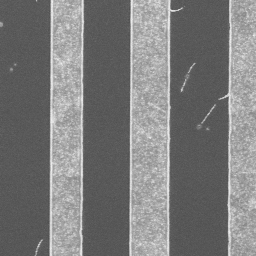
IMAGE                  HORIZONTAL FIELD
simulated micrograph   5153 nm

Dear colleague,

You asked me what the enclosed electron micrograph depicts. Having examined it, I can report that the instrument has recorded one or a few lines or trenches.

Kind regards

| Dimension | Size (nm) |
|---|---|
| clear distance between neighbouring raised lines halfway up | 1100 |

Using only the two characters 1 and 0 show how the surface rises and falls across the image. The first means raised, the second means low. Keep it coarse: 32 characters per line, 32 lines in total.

00000001110000001111100000000111
00000001110000001111100000000111
00000001110000001111100000000111
00000001110000001111100000000111
00000001110000001111100000000111
00000001110000001111100000000111
00000001110000001111100000000111
00000001110000001111100000000111
00000001110000001111100000000111
00000001110000001111100000000111
00000001110000001111100000000111
00000001110000001111100000000111
00000011110000001111100000000111
00000011110000001111100000000111
00000001110000001111100000000111
00000001110000001111100000000111
00000001110000001111100000000111
00000011110000001111100000000110
00000011110000001111100000000111
00000011110000001111100000000111
00000011110000001111100000000111
00000011110000001111100000000111
00000011110000001111100000000111
00000011110000001111100000000111
00000011110000001111100000000111
00000011110000001111100000000111
00000011110000001111100000000111
00000011110000001111100000000111
00000011110000001111100000000111
00000011110000001111100000000111
00000011110000001111100000000111
00000011110000001111100000000111